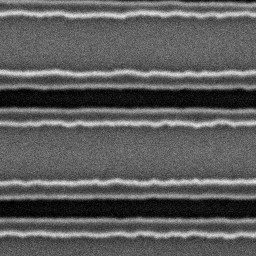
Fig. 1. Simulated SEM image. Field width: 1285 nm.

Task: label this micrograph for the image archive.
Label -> lines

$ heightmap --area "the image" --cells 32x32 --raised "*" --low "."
********************************
********************************
................................
................................
................................
................................
................................
................................
................................
********************************
********************************
................................
................................
................................
********************************
*******.************.******..***
................................
................................
................................
................................
................................
................................
..............*.................
********************************
********************************
................................
................................
********************************
********************************
......***..***..*..**....*****.*
................................
................................